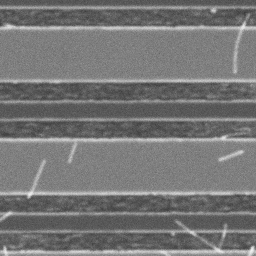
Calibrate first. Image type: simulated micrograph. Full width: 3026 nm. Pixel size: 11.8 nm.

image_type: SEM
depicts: lines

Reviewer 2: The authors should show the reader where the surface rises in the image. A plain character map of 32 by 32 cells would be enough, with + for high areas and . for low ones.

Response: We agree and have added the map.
++++++++++++++++++++++++++++++++
................................
................................
++++++++++++++++++++++++++++++++
++++++++++++++++++++++++++++++++
++++++++++++++++++++++++++++++++
++++++++++++++++++++++++++++++++
++++++++++++++++++++++++++++++++
++++++++++++++++++++++++++++++++
++++++++++++++++++++++++++++++++
................................
................................
................................
++++++++++++++++++++++++++++++++
++++++++++++++++++++++++++++++++
................................
................................
++++++++++++++++++++++++++++++++
++++++++++++++++++++++++++++++++
++++++++++++++++++++++++++++++++
++++++++++++++++++++++++++++++++
++++++++++++++++++++++++++++++++
++++++++++++++++++++++++++++++++
++++++++++++++++++++++++++++++++
................................
................................
................................
++++++++++++++++++++++++++++++++
++++++++++++++++++++++++++++++++
................................
................................
++++++++++++++++++++++++++++++++